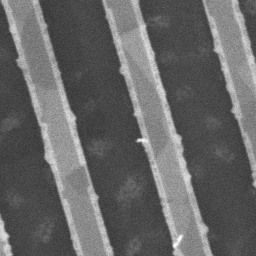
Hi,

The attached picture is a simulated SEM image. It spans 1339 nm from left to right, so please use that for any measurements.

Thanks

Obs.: one or a few lines or trenches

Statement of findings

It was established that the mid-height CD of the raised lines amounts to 178 nm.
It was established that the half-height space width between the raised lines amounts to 324 nm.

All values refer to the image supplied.